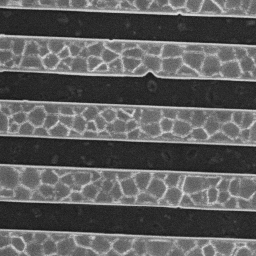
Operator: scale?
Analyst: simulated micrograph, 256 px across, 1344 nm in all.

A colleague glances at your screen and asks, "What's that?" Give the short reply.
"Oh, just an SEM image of one or a few lines or trenches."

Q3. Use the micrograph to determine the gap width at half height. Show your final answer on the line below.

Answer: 154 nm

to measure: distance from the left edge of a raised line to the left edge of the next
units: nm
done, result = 340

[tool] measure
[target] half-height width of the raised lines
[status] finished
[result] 183 nanometers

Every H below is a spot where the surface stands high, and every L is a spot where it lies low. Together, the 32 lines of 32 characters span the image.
HHHHHHHHHHHHHHHHHHHHHHHHHHHHHHHH
LLLLLLLLLLLLLLLLHHHHHHHHHHHHHHHH
LLLLLLLLLLLLLLLLLLLLLLLLLLLLLLLL
LLLLLLLLLLLLLLLLLLLLLLLLLLLLLLLL
HLLLLLLLLLLLLLLLLLLLLLLLLLLLLLLL
HHHHHHHHHHHHHHHHHHHHHHHHHLLLLLLL
HHHHHHHHHHHHHHHHHHHHHHHHHHHHHHHH
HHHHHHHHHHHHHHHHHHHHHHHHHHHHHHHH
HHHHHHHHHHHHHHHHHHHHHHHHHHHHHHHH
LLLLLLLLLLLLLLLLLLLLHHHHHHHHHHHH
LLLLLLLLLLLLLLLLLLLLLLLLLLLLLLLL
LLLLLLLLLLLLLLLLLLLLLLLLLLLLLLLL
LLLLLLLLLLLLLLLLLLLLLLLLLLLLLLLL
HHHHHHHHHHHHHHHHHHHHHHLLLLLLLLLL
HHHHHHHHHHHHHHHHHHHHHHHHHHHHHHHH
HHHHHHHHHHHHHHHHHHHHHHHHHHHHHHHH
HHHHHHHHHHHHHHHHHHHHHHHHHHHHHHHH
LLLLLLLLLLLLLLLLHHHHHHHHHHHHHHHH
LLLLLLLLLLLLLLLLLLLLLLLLLLLLLLLL
LLLLLLLLLLLLLLLLLLLLLLLLLLLLLLLL
LLLLLLLLLLLLLLLLLLLLLLLLLLLLLLLL
HHHHHHHHHHHHHHHHHHHHHHLLLLLLLLLL
HHHHHHHHHHHHHHHHHHHHHHHHHHHHHHHH
HHHHHHHHHHHHHHHHHHHHHHHHHHHHHHHH
HHHHHHHHHHHHHHHHHHHHHHHHHHHHHHHH
LLLLLLLLLLLLLHHHHHHHHHHHHHHHHHHH
LLLLLLLLLLLLLLLLLLLLLLLLLLLLLLLL
LLLLLLLLLLLLLLLLLLLLLLLLLLLLLLLL
LLLLLLLLLLLLLLLLLLLLLLLLLLLLLLLL
HHHHHHHHHHHHHHHHLLLLLLLLLLLLLLLL
HHHHHHHHHHHHHHHHHHHHHHHHHHHHHHHH
HHHHHHHHHHHHHHHHHHHHHHHHHHHHHHHH